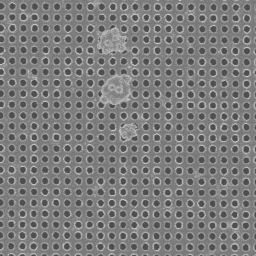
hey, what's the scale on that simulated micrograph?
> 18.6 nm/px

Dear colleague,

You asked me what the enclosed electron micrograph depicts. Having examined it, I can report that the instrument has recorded a regular array of holes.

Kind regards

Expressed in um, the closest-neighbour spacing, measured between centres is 0.197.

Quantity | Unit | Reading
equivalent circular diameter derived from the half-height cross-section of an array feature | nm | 119